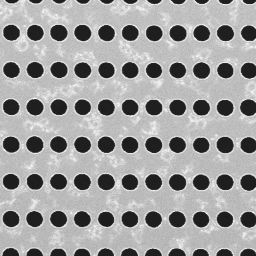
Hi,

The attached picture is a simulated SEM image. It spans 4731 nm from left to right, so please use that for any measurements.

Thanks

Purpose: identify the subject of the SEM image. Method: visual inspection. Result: a regular array of holes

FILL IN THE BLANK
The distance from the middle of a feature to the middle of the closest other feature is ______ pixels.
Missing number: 23.7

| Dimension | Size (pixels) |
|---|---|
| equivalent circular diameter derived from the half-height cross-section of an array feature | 16.6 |